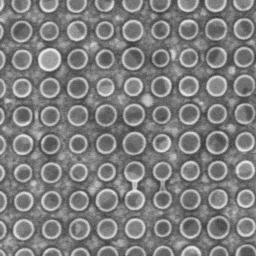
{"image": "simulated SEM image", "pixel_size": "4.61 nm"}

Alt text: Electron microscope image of a regular array of raised bodies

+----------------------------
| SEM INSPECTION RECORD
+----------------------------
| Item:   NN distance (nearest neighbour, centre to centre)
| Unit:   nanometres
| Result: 127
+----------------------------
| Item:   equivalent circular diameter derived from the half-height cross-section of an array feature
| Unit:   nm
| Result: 86.8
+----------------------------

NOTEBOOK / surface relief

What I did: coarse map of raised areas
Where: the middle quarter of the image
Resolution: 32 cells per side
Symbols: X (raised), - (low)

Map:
--XXX----XX----XXXX-----X-------
--------------------------------
--------------------------------
------------------------X-----XX
-XXXXX---XXX----XXX---XXXXX--XXX
-XXXXX--XXXX---XXXX---XXXXX--XXX
-XXXXX--XXXX---XXXX---XXXXX--XXX
-XXXX----XXX----XX-----XXX----XX
--------------------------------
--------------------------------
----------X-----XXX-----------XX
--XXX---XXXXX--XXXXX---XXX---XXX
-XXXXX--XXXXX--XXXXX---XXX---XXX
-XXXXX--XXXXX--XXXXX---XXX---XXX
--XXX---XXXX---XXXX----XX-----XX
--------------------------------
--------------------------------
-----------------XX-----------XX
--XXX----XXX---XXXXX---XXX---XXX
--XXXX--XXXXX--XXXXX--XXXX---XXX
--XXXX--XXXXX--XXXXX--XXXX---XXX
--XXX----XXX---XXXXX---XXX----XX
-----------------XX-------------
--------------------------------
-------------------------------X
--XXX----XXX----XXXX---XXX----XX
--XXXX---XXXX--XXXXX--XXXXX---XX
--XXXX---XXXX--XXXXX--XXXXX---XX
--XXX----XXX----XXX----XXX----XX
------------------------X-------
------------------------X-------
-----------X------------X------X